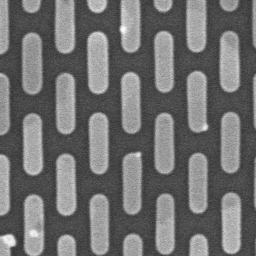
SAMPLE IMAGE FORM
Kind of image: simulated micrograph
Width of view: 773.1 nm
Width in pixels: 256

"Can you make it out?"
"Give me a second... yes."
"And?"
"groups of lines, slits or small figures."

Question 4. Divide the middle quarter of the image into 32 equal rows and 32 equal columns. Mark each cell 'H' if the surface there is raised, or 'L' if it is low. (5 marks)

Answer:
LLLLLLHHHHHLLLLLLLLLLLLHHHHLLLLL
LLLLLLHHHHHLLLLLLLLLLLLHHHHLLLLL
HLLLLLHHHHHLLLLHHHLLLLLHHHHLLLLL
HHLLLLHHHHHLLLLHHHHLLLLHHHHLLLLH
HHLLLLHHHHHLLLHHHHHLLLLHHHHLLLLH
HHLLLLHHHHHLLLLHHHHLLLLHHHHLLLLH
HHLLLLLHHHLLLLLHHHHLLLLLHHLLLLLH
HHLLLLLLLLLLLLLHHHHLLLLLLLLLLLLH
HHLLLLLLLLLLLLLHHHHLLLLLLLLLLLLH
HHLLLLLLLLLLLLLHHHHLLLLLLLLLLLLH
HHLLLLLLLLLLLLLHHHHLLLLLLLLLLLLH
HHLLLLLLLLLLLLLHHHHLLLLLLLLLLLLH
HHLLLLLLHLLLLLLHHHHLLLLLHHLLLLLH
HHLLLLLHHHHLLLLHHHHLLLLHHHHLLLLH
HHLLLLHHHHHLLLLHHHHLLLLHHHHLLLLH
HHLLLLHHHHHLLLLHHHHLLLLHHHHLLLLH
HHLLLLHHHHHLLLLHHHHLLLLHHHHLLLLL
LLLLLLLHHHHLLLLLLLLLLLLHHHHLLLLL
LLLLLLLHHHHLLLLLLLLLLLLHHHHLLLLL
LLLLLLLHHHHLLLLLLLLLLLLHHHHLLLLL
LLLLLLLHHHHLLLLLLLLLLLLHHHHLLLLL
LLLLLLLHHHHLLLLLLLLLLLLHHHHLLLLL
LLLLLLLHHHHLLLLLHHHLLLLHHHHLLLLL
HHLLLLLHHHHLLLLHHHHLLLLHHHHLLLLL
HHLLLLLHHHHLLLLHHHHLLLLHHHHLLLLH
HHLLLLLHHHHLLLLHHHHLLLLHHHHLLLLH
HHLLLLLHHHHLLLLHHHHLLLLHHHHLLLLH
HHLLLLLLLLLLLLLHHHHLLLLLLLLLLLLH
HHHLLLLLLLLLLLLHHHHLLLLLLLLLLLLH
HHHLLLLLLLLLLLLHHHHLLLLLLLLLLLLH
HHHLLLLLLLLLLLLHHHHLLLLLLLLLLLLH
HHHLLLLLLLLLLLLHHHHLLLLLLLLLLLLH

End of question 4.